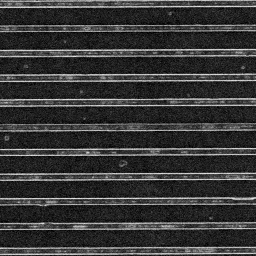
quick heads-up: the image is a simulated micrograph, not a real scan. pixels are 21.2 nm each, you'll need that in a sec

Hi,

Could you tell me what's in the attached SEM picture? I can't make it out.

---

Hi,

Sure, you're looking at parallel lines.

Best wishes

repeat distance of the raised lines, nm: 524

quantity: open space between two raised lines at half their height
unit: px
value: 18.5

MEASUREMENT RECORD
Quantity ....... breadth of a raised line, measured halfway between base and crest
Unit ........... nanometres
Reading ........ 130